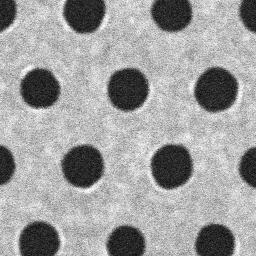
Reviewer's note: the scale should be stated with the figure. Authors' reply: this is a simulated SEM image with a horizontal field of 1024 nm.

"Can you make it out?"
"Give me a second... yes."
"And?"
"holes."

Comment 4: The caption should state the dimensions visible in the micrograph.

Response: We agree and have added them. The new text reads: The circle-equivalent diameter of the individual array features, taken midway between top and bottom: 0.178 µm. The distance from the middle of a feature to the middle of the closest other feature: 352 nm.